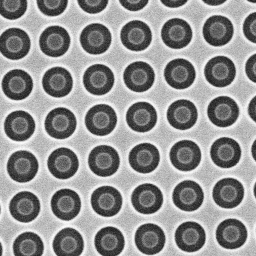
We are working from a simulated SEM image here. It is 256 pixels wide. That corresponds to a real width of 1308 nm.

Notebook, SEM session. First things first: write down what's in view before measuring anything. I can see an array of small figures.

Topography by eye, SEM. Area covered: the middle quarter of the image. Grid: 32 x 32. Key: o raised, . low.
oooooo.....ooooo......ooo.......
.oooo.......ooo.......ooo..oooo.
..ooo..ooo..ooo..ooo...oo..oooo.
..oo...ooo...oo..oooo..oo..oooo.
..ooo..ooo...oo..ooo...oo.......
..ooo...oo..ooo.......oooo......
..ooo.......oooo.....oooooooo.oo
.ooooo.....ooooooooooooooooooooo
oooooooooooooooooooooooooooooooo
oooooooooooooooooo...oooooo.....
ooooooo.....oooo......oooo......
.ooooo.......ooo...o...ooo..ooo.
..ooo...oo...oo...ooo..oo...ooo.
o..oo..oooo..oo...ooo...o...ooo.
o..oo..oooo..oo...ooo..ooo......
o..oo...ooo..ooo.......oooo.....
...ooo......ooooo.....ooooooo..o
..ooooo.....oooooooooooooooooooo
.ooooooooooooooooooooooooooooooo
oooooooooooooooooooooooooooo....
oooooooo....oooooo.....oooo.....
..ooooo......oooo.......oo...oo.
...ooo...oo...oo...ooo..oo..oooo
o...oo..oooo..oo..oooo..oo..oooo
oo..oo..oooo..oo...ooo..ooo..oo.
oo..oo..ooo...oo........ooo.....
o..oooo......oooo......ooooo....
...ooooo.....ooooooo.ooooooooooo
..oooooooooooooooooooooooooooooo
ooooooooooooooooooooooooooooo...
ooooooooo...oooooo.....ooooo....
..ooooo.......ooo.......ooo...oo